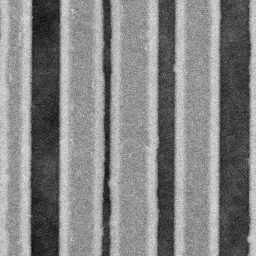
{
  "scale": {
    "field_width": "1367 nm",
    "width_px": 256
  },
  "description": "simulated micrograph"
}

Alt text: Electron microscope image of one or a few lines or trenches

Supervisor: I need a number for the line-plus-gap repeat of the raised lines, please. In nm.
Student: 325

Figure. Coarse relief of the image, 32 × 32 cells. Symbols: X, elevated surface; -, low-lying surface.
-XX-----XXXX--XXXXX----XXXX-----
-XX-----XXXX---XXXX----XXXX-----
-XX-----XXXX---XXXX----XXXX-----
-XX-----XXXX---XXXX----XXXX-----
-XX-----XXXX---XXXX----XXXX-----
-XX-----XXXX---XXXX----XXXX-----
XXX-----XXXX---XXXX----XXXX-----
XXX-----XXXX---XXXX----XXXX-----
XXX-----XXXX---XXXX---XXXXX-----
XXX-----XXXX---XXXX----XXXX-----
XXX-----XXXX---XXXX----XXXX-----
XXX-----XXXX---XXXX----XXXX-----
XXX-----XXXX--XXXXX----XXXX-----
XXX-----XXXX---XXXX----XXXX-----
XXX-----XXXX---XXXX----XXXX-----
XXX-----XXXX---XXXX----XXXX-----
XXX-----XXXX---XXXX----XXXX-----
XXX-----XXXX---XXXX----XXXX-----
XXX-----XXXX---XXXX----XXXX-----
XXX-----XXXX--XXXXX----XXXX-----
XXX-----XXXX--XXXXX----XXXX-----
XXX-----XXXX--XXXXX----XXXX-----
XXX-----XXXX--XXXXX----XXXX-----
XXX-----XXXX--XXXXX----XXXX-----
XXX-----XXXX--XXXXX----XXXX-----
XXX-----XXXX--XXXXX---XXXXX-----
XXX-----XXXX--XXXXX---XXXXX-----
XXX-----XXXX--XXXXX----XXXX-----
XXX-----XXXX--XXXXX----XXXX-----
XXX-----XXXX--XXXXX---XXXXX-----
XXX-----XXXX--XXXXX---XXXXX-----
XXX-----XXXX--XXXXX---XXXXX-----